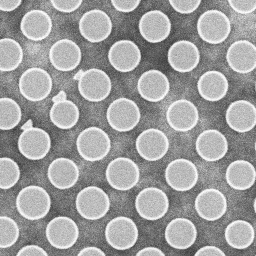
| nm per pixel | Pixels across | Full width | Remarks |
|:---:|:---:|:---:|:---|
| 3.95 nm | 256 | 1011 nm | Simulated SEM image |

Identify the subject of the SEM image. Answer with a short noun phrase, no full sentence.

a regular array of raised bodies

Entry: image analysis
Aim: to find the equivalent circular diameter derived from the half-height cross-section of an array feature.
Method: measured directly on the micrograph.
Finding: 122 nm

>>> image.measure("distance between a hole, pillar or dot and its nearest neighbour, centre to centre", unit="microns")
0.164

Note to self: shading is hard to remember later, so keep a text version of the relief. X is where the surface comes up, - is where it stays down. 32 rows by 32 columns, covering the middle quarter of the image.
XXX---------XXXXXX---------XXXXX
X-----XX------XXX------------XX-
-----XXXXX----------XXXX--------
----XXXXXXX--------XXXXXX-------
----XXXXXXXX-------XXXXXXX------
----XXXXXXX--------XXXXXXX------
----XXXXXXXX-------XXXXXXX------
----XXXXXXX--------XXXXXX-------
------XXXX----------XXXX--------
X------------XXXX-----------XXX-
XXX---------XXXXXX---------XXXXX
XXX--------XXXXXXX--------XXXXXX
XXX--------XXXXXXXX-------XXXXXX
XXX--------XXXXXXXX-------XXXXXX
XXX--------XXXXXXX--------XXXXXX
XX----------XXXXXX---------XXXXX
-----XXXX-----XX-----XX-------X-
----XXXXXX---------XXXXXX-------
----XXXXXXX--------XXXXXXX------
---XXXXXXXX-------XXXXXXXX------
---XXXXXXXX-------XXXXXXXX------
----XXXXXXX-------XXXXXXXX------
----XXXXXXX--------XXXXXX-------
-----XXXX-----------XXXX--------
XX----------XXXXX----------XXXX-
XXX--------XXXXXXX--------XXXXXX
XXX--------XXXXXXX--------XXXXXX
XXX--------XXXXXXXX-------XXXXXX
XXX--------XXXXXXX--------XXXXXX
XXX--------XXXXXXX--------XXXXXX
XX----------XXXXX----------XXXXX
-----XXXX-----------XXXX--------